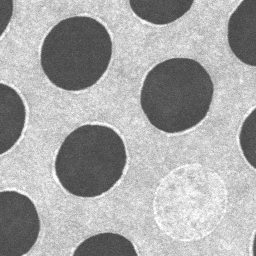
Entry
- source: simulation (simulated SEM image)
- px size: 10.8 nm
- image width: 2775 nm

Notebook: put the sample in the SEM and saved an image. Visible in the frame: holes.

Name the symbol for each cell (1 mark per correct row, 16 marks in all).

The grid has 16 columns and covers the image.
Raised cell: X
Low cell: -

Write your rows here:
-XXXXXXX----XXX-
-XXX--XXXXXXXX--
XXX----XXXXXXX--
XXX----XXXXXXXX-
XXX----XX----XXX
-XXX-XXXX----XXX
-XXXXXXXX----XXX
--XXXXXXX----XX-
-XXX---XXXXXXXX-
XXXX----XXXXXXX-
XXX-----XXXXXXXX
XXXX---XXXXXXXXX
--XXXXXXXXXXXXXX
--XXXXXXXXXXXXXX
--XXXXXXXXXXXXXX
--XXX---XXXXXXXX